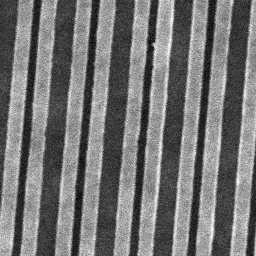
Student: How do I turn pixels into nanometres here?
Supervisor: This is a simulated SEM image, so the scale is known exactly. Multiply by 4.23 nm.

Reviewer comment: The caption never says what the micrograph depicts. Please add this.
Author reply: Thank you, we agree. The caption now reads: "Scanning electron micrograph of parallel lines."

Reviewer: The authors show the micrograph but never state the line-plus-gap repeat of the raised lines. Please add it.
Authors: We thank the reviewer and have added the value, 122 nanometres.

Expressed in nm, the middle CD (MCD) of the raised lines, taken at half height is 60.5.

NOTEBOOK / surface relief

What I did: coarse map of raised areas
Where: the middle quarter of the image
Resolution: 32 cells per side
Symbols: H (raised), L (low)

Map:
LLHHHLLLHHHLLLLLLHHHLLLHHHLLLLLH
LLHHHLLLHHHLLLLLLHHHLLHHHHLLLLLH
LLHHHLLLHHHLLLLLHHHHLLHHHHLLLLLH
LLHHHLLLHHHLLLLLLHHHLLHHHHLLLLLH
LLHHHLLLHHHLLLLLLHHHLLHHHHLLLLLH
LLHHHLLHHHHLLLLLHHHHLLHHHHLLLLLH
LHHHHLLHHHHLLLLLHHHHLLHHHHLLLLLH
LHHHHLLHHHHLLLLLHHHLLLHHHLLLLLLH
LHHHHLLHHHHLLLLLHHHLLLHHHLLLLLLH
LHHHHLLHHHLLLLLLHHHLLLHHHLLLLLLH
LHHHLLLHHHLLLLLLHHHLLLHHHLLLLLHH
LHHHLLLHHHLLLLLLHHHLLLHHHLLLLLHH
LHHHLLLHHHLLLLLLHHHLLLHHHLLLLLHH
LHHHLLLHHHLLLLLLHHHLLHHHHLLLLLHH
LHHHLLLHHHLLLLLLHHHLLHHHHLLLLLHH
LHHHLLLHHHLLLLLHHHHLLHHHHLLLLLHH
LHHHLLLHHHLLLLLHHHHLLHHHLLLLLLHH
LHHHLLHHHHLLLLLHHHHLLHHHLLLLLLHH
HHHHLLHHHHLLLLLHHHLLLHHHLLLLLLHH
HHHHLLHHHHLLLLLHHHLLLHHHLLLLLHHH
HHHHLLHHHLLLLLLHHHLLLHHHLLLLLHHH
HHHHLLHHHHLLLLLHHHLLLHHHLLLLLHHH
HHHHLLHHHLLLLLLHHHLLLHHHLLLLLHHH
HHHLLLHHHLLLLLLHHHLLHHHHLLLLLHHH
HHHLLLHHHLLLLLLHHHLLHHHHLLLLLHHH
HHHLLLHHHLLLLLLHHHLLHHHHLLLLLHHH
HHHLLHHHHLLLLLHHHHLLHHHHLLLLLHHH
HHHLLHHHHLLLLLHHHHLLHHHHLLLLLHHH
HHHLLHHHHLLLLLHHHHLLHHHHLLLLLHHH
HHHLLHHHHLLLLLHHHHLLHHHHLLLLLHHH
HHHLLHHHHLLLLLHHHHLLHHHLLLLLLHHH
HHHLLHHHLLLLLLHHHLLLHHHLLLLLLHHH